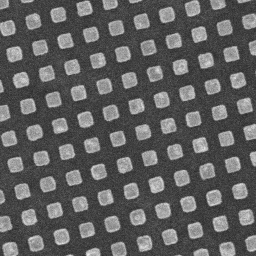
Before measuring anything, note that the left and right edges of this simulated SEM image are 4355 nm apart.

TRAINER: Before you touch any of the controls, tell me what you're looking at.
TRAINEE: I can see a regular array of raised bodies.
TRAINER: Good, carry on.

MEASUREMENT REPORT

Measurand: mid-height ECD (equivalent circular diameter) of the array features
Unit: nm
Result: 260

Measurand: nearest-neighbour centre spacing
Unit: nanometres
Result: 444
